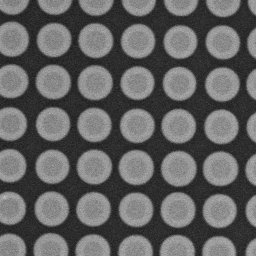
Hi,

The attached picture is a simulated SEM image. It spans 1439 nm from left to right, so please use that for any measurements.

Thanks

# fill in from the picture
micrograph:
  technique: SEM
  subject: an array of small figures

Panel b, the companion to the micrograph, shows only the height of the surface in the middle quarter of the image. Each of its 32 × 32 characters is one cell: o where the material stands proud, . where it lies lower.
................................
.....oooooo.....ooooo......oooo.
o...oooooooo...ooooooo...ooooooo
oo..oooooooo..oooooooo...ooooooo
oo..oooooooo..oooooooo...ooooooo
oo..oooooooo..oooooooo...ooooooo
o...oooooooo...ooooooo...ooooooo
o...ooooooo....oooooo.....oooooo
......oooo.......ooo.......oooo.
................................
................................
.....ooooo.......ooo.......ooo..
o...ooooooo....oooooo.....oooooo
o...ooooooo...oooooooo...ooooooo
o..ooooooooo..ooooooooo..ooooooo
o..ooooooooo..ooooooooo.oooooooo
o...oooooooo..ooooooooo..ooooooo
o...ooooooo....ooooooo...ooooooo
.....ooooo.....oooooo.....oooooo
.................ooo.......ooo..
................................
................................
.....ooooo.....oooooo.....ooooo.
o...ooooooo...oooooooo...ooooooo
o..ooooooooo..oooooooo...ooooooo
o..ooooooooo..oooooooo..oooooooo
o..ooooooooo..oooooooo..oooooooo
o...oooooooo..oooooooo..oooooooo
....ooooooo....ooooooo...ooooooo
.....ooooo......ooooo.....oooooo
.............................o..
................................